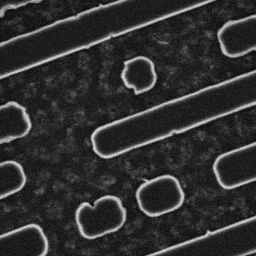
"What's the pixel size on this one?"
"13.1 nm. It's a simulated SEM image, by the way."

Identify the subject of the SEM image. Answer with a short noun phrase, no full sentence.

one or a few lines or trenches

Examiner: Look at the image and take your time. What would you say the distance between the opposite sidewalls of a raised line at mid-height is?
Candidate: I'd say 30.8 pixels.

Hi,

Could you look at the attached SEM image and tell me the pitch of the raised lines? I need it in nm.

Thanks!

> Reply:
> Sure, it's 813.